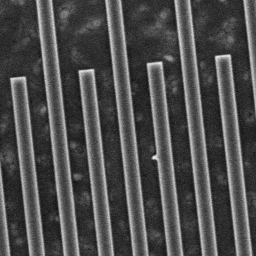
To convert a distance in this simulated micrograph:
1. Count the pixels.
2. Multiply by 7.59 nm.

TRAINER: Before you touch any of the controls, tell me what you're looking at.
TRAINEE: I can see parallel lines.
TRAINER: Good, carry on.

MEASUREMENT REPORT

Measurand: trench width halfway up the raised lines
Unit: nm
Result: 147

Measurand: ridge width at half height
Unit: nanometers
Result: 115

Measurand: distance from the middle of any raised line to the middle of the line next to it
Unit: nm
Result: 260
